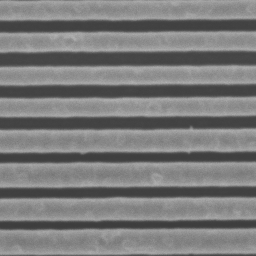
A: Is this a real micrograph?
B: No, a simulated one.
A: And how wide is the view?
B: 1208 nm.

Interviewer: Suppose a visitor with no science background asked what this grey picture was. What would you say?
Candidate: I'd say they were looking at parallel lines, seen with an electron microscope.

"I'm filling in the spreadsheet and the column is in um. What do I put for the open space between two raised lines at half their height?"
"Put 0.0531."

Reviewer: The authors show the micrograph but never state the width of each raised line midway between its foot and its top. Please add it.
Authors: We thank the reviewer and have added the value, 111 nanometers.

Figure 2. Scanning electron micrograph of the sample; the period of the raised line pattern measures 158 nanometres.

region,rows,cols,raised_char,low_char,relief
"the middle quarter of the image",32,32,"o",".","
.......ooooo.ooooo.ooooooooo.ooo
oooooooooooooooooooooooooooooooo
oooooooooooooooooooooooooooooooo
oooooooooooooooooooooooooooooooo
oooooooooooooooooooooooooooooooo
................................
................................
................................
.......oo...oooooooooooooooooooo
oooooooooooooooooooooooooooooooo
oooooooooooooooooooooooooooooooo
oooooooooooooooooooooooooooooooo
oooooooooooooooooooooooooooooooo
................................
................................
................................
oooooooo.ooooooooooooooooooooooo
oooooooooooooooooooooooooooooooo
oooooooooooooooooooooooooooooooo
oooooooooooooooooooooooooooooooo
oooooooooooooooooooooooooooooooo
oooooooooooooooooooooooooooooooo
................................
................................
.......................ooooooooo
oooooooooooooooooooooooooooooooo
oooooooooooooooooooooooooooooooo
oooooooooooooooooooooooooooooooo
oooooooooooooooooooooooooooooooo
oooooooooooooooooooooooooooooooo
oooooooooooooooooooooooooooooooo
................................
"